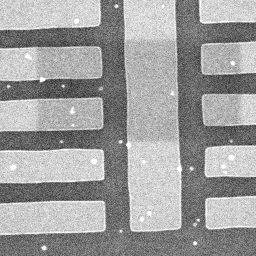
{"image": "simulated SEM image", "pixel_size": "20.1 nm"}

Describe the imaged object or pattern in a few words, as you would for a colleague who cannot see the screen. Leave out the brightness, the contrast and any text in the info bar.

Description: groups of lines, slits or small figures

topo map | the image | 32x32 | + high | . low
++++++++++++....++++++...+++++++
+++++++++++++...++++++...+++++++
+++++++++++++...++++++...+++++++
+++++...........++++++..........
................++++++..........
................++++++....++++++
+++++++++++++...++++++...+++++++
+++++++++++++...++++++...+++++++
+++++++++++++...++++++...+++++++
++++++++++++....++++++..........
................++++++..........
................++++++..........
.....++++++++...++++++...+++++++
+++++++++++++...++++++...+++++++
+++++++++++++...++++++...+++++++
+++++++++++++...++++++....++++++
................++++++..........
................++++++..........
................++++++....++++++
+++++++++++++...++++++....++++++
+++++++++++++...++++++....++++++
+++++++++++++...+++++++...++++++
+++++++++++.....+++++++.........
................+++++++.........
................+++++++.........
..+++++++++++...+++++++...++++++
+++++++++++++...+++++++...++++++
+++++++++++++...+++++++...++++++
+++++++++++++...++++++....++....
................................
................................
................................